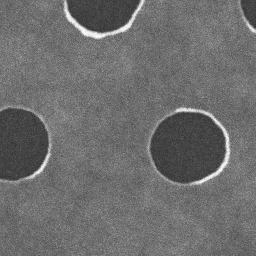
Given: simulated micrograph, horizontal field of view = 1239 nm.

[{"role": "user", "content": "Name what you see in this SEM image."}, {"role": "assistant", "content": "holes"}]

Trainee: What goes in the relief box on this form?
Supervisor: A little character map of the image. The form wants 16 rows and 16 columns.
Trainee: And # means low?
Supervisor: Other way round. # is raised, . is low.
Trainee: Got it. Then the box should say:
####.....######.
#####...########
################
################
################
################
################
...#######...###
...#######....##
...######.....##
..########....##
################
################
################
################
################